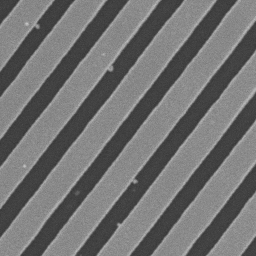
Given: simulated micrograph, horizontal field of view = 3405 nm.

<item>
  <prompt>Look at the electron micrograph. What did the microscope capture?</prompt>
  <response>lines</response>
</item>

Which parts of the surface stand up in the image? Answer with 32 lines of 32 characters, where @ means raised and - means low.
--@@@@---@@@@---@@@@---@@@@--@@@
-@@@@@--@@@@---@@@@---@@@@---@@@
-@@@@--@@@@---@@@@---@@@@---@@@@
@@@@---@@@@--@@@@---@@@@---@@@@-
@@@---@@@@---@@@@--@@@@@--@@@@@-
@@@--@@@@---@@@@---@@@@---@@@@--
@@--@@@@---@@@@---@@@@---@@@@---
@---@@@@--@@@@---@@@@---@@@@---@
---@@@@---@@@@--@@@@@--@@@@---@@
--@@@@---@@@@---@@@@---@@@@---@@
-@@@@---@@@@---@@@@---@@@@---@@@
-@@@@--@@@@---@@@@---@@@@---@@@@
@@@@--@@@@---@@@@---@@@@---@@@@-
@@@---@@@@---@@@@--@@@@@--@@@@--
@@---@@@@---@@@@---@@@@---@@@@--
@---@@@@---@@@@---@@@@---@@@@---
@--@@@@---@@@@---@@@@---@@@@---@
---@@@@--@@@@@--@@@@---@@@@---@@
--@@@@---@@@@---@@@@--@@@@@--@@@
-@@@@---@@@@---@@@@---@@@@---@@@
@@@@---@@@@---@@@@---@@@@---@@@@
@@@---@@@@@--@@@@---@@@@---@@@@-
@@@---@@@@--@@@@@--@@@@---@@@@--
@@---@@@@---@@@@---@@@@--@@@@@--
@---@@@@---@@@@---@@@@---@@@@---
---@@@@---@@@@---@@@@---@@@@---@
---@@@@--@@@@---@@@@---@@@@---@@
--@@@@---@@@@---@@@@--@@@@@--@@@
-@@@@---@@@@---@@@@---@@@@---@@@
@@@@---@@@@---@@@@---@@@@---@@@@
@@@@--@@@@---@@@@---@@@@---@@@@-
@@@---@@@@--@@@@@--@@@@---@@@@--